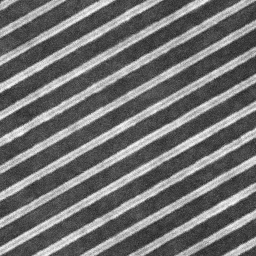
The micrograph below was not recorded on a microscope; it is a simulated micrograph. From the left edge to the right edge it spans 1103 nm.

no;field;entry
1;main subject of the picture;parallel lines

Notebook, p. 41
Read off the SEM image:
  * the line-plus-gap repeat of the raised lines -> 102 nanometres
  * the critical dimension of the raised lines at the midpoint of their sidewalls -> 27.6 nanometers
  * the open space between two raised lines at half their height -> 75.8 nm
